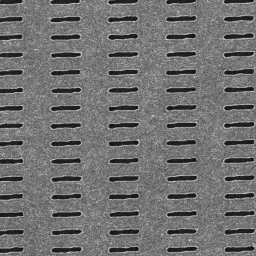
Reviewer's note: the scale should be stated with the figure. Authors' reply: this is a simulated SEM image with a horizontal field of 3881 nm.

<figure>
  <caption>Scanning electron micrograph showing a regular array of holes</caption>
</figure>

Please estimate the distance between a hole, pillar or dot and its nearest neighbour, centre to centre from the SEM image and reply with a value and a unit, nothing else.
268 nm